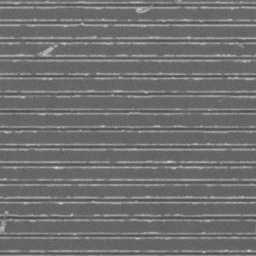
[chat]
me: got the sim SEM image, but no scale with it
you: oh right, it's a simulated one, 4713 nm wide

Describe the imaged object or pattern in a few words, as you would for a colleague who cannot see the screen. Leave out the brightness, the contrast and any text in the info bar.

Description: parallel lines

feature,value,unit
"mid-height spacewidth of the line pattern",62.1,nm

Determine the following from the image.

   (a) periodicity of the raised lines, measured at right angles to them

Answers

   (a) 326 nm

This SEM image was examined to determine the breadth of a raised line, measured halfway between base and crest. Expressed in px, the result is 14.2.